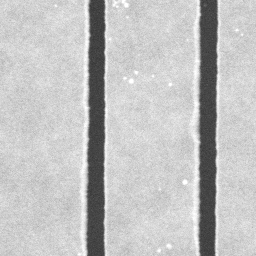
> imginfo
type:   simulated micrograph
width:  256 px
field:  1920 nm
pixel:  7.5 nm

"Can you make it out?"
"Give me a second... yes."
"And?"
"lines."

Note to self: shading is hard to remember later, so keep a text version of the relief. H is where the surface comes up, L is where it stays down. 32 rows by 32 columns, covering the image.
HHHHHHHHHHHLLHHHHHHHHHHHHLLHHHHH
HHHHHHHHHHHLLHHHHHHHHHHHHLLHHHHH
HHHHHHHHHHHLLHHHHHHHHHHHHLLHHHHH
HHHHHHHHHHHLLHHHHHHHHHHHHLLHHHHH
HHHHHHHHHHHLLHHHHHHHHHHHHLLHHHHH
HHHHHHHHHHHLLHHHHHHHHHHHHLLHHHHH
HHHHHHHHHHHLLHHHHHHHHHHHHLLHHHHH
HHHHHHHHHHHLLHHHHHHHHHHHHLLHHHHH
HHHHHHHHHHHLLHHHHHHHHHHHHLLHHHHH
HHHHHHHHHHHLLHHHHHHHHHHHHLLHHHHH
HHHHHHHHHHHLLHHHHHHHHHHHHLLHHHHH
HHHHHHHHHHHLLHHHHHHHHHHHHLLHHHHH
HHHHHHHHHHHLLHHHHHHHHHHHHLLHHHHH
HHHHHHHHHHHLLHHHHHHHHHHHHLLHHHHH
HHHHHHHHHHHLLHHHHHHHHHHHHLLHHHHH
HHHHHHHHHHHLLHHHHHHHHHHHHLLHHHHH
HHHHHHHHHHHLLHHHHHHHHHHHHLLHHHHH
HHHHHHHHHHHLLHHHHHHHHHHHHLLHHHHH
HHHHHHHHHHHLLHHHHHHHHHHHHLLHHHHH
HHHHHHHHHHHLLHHHHHHHHHHHHLLHHHHH
HHHHHHHHHHHLLHHHHHHHHHHHHLLHHHHH
HHHHHHHHHHHLLHHHHHHHHHHHHLLHHHHH
HHHHHHHHHHHLLHHHHHHHHHHHHLLHHHHH
HHHHHHHHHHHLLHHHHHHHHHHHHLLHHHHH
HHHHHHHHHHHLLHHHHHHHHHHHHLLHHHHH
HHHHHHHHHHHLLHHHHHHHHHHHHLLHHHHH
HHHHHHHHHHHLLHHHHHHHHHHHHLLHHHHH
HHHHHHHHHHHLLHHHHHHHHHHHHLLHHHHH
HHHHHHHHHHHLLHHHHHHHHHHHHLLHHHHH
HHHHHHHHHHHLLHHHHHHHHHHHHLLHHHHH
HHHHHHHHHHHLLHHHHHHHHHHHHLLHHHHH
HHHHHHHHHHHLLHHHHHHHHHHHHLLHHHHH